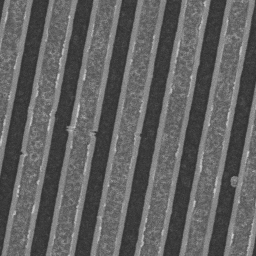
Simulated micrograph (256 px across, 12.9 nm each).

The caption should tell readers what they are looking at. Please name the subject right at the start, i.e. parallel lines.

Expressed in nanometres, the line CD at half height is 299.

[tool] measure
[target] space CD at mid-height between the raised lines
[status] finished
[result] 263 nm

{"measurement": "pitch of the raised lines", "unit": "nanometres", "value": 566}